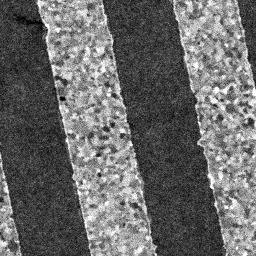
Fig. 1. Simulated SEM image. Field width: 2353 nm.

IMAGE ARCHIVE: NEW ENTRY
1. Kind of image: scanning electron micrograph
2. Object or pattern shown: one or a few lines or trenches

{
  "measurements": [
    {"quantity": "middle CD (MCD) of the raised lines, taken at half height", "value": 573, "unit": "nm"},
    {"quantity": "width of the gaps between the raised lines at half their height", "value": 624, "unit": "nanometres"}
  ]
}